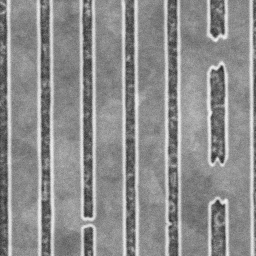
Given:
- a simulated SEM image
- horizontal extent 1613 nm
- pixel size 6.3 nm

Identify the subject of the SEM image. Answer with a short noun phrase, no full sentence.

parallel lines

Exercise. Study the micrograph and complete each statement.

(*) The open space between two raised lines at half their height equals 0.0795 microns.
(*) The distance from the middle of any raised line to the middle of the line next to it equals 270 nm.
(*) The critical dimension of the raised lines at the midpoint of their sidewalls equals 192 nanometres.